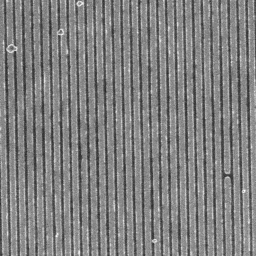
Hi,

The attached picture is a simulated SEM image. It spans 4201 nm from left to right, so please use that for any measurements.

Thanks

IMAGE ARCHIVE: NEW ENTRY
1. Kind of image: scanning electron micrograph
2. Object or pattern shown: parallel lines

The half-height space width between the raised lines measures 78 nm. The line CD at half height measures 69.7 nm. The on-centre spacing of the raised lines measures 147 nm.